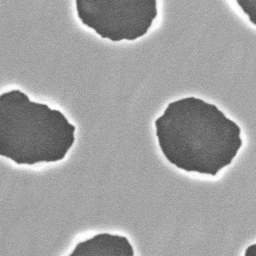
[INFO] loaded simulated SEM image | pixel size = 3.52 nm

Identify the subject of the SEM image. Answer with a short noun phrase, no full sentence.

holes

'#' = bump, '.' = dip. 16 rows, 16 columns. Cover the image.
#####.....#####.
#####.....######
#######.########
################
################
################
...########..###
....######....##
.....#####.....#
....######.....#
###########...##
################
################
################
################
####....########